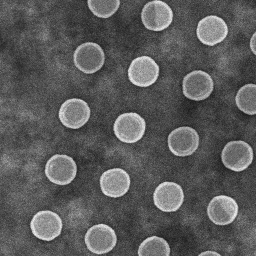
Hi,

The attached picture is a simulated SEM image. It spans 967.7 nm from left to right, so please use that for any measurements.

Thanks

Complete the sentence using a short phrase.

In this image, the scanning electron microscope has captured a regular array of raised bodies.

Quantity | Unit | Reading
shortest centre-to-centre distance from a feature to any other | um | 0.211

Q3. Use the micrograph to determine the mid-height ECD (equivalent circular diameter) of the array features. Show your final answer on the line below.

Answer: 108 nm